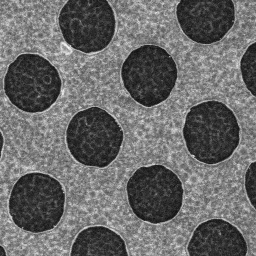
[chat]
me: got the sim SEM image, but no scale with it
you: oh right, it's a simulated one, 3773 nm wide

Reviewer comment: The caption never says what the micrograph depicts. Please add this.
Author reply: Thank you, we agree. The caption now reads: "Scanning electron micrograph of holes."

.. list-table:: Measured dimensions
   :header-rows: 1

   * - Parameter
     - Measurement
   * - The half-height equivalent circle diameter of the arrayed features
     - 0.858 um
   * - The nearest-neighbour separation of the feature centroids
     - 1.23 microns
